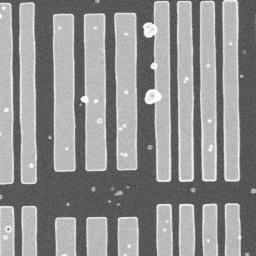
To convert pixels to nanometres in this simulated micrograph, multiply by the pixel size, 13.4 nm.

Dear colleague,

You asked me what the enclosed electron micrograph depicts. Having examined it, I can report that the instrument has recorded groups of lines, slits or small figures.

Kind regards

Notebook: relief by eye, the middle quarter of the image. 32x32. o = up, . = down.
oo...ooooo...ooooo....oooo..oooo
oo...ooooo...ooooo.....ooo..oooo
oo...ooooo...ooooo.....ooo..oooo
oo...ooooo...ooooo.....ooo..oooo
oo...ooooo...ooooo.....ooo...ooo
oo...ooooo...ooooo.....ooo...ooo
oo...ooooo...ooooo...ooooo...ooo
oo...ooooo...ooooo...ooooo...ooo
oo..oooooo...ooooo..oooooo...ooo
oo...ooooo...ooooo...ooooo...ooo
oo...ooooo...ooooo.....ooo...ooo
oo....oooo...ooooo.....ooo...ooo
oo....oooo...ooooo.....ooo...ooo
ooo...oooo...ooooo.....oooo..ooo
ooo..ooooo...ooooo.....oooo..ooo
ooo..ooooo...ooooo.....oooo..ooo
ooo..ooooo...ooooo.....oooo..ooo
ooo...oooo...ooooo.....oooo..ooo
ooo...oooo...ooooo.....oooo..ooo
ooo...oooo...ooooo.....oooo..ooo
ooo..oooooo..ooooo.....oooo..ooo
ooo..oooooo..ooooo.....oooo..ooo
ooo..oooooo..ooooo.....oooo..ooo
ooo..oooooo..ooooo.....oooo..ooo
ooo...ooooo..ooooo.....oooo..ooo
ooo...ooooo..ooooo.....oooo..ooo
ooo...oooo....o........oooo..ooo
.......................oooo..ooo
.......................oooo..ooo
................................
................................
................................